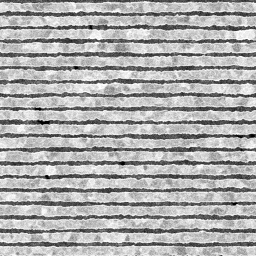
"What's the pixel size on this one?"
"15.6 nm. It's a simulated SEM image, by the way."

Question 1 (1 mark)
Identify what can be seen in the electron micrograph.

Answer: parallel lines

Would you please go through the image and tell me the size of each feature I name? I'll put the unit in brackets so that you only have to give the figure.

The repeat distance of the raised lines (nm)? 211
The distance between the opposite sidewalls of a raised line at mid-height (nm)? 140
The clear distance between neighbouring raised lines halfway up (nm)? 74.1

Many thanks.